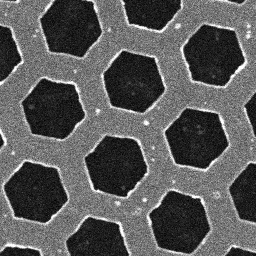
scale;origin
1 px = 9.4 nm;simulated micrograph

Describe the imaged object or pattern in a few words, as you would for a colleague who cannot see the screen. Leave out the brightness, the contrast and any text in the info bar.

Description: holes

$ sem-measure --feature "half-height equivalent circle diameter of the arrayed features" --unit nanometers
558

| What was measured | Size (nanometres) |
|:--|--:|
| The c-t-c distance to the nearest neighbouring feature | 796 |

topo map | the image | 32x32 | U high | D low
UUUUUUDDDDDDUUUDDDDDDDDUUUUUUUUU
UUUUUUDDDDDDUUUUDDDDDDUUUUUUUUUU
UUUUUDDDDDDDUUUUDDDDDUUUUUUUUUUU
DUUUUDDDDDDDDUUUUUDDUUUUUDDDUUUU
DDUUUUDDDDDDUUUUUUUUUUUUDDDDDDUU
DDUUUUDDDDDDUUUUUUUUUUUDDDDDDDUU
DDUUUUUDDDDUUUUDUUUUUUUDDDDDDDUU
DDDUUUUUUUUUUUDDDDDUUUUDDDDDDDDU
DDUUUUUUUUUUUUDDDDDDUUUUDDDDDDUU
DUUUUUUUUUUUUDDDDDDDUUUUDDDDDUUU
UUUUUDDDDUUUUDDDDDDDUUUUUUDDUUUU
UUUUDDDDDDUUUDDDDDDDUUUUUUUUUUUU
UUUDDDDDDDUUUUDDDDDDUUUUUUUUUUUD
UUUDDDDDDDUUUUUDDDDUUUUUUUUUUUUD
UUUDDDDDDDDUUUUUUUUUUUDDDDDUUUUD
UUUUDDDDDDUUUUUUUUUUUDDDDDDDUUUD
UUUUDDDDDUUUUUUUUUUUUDDDDDDDUUUU
UUUUUUUUUUUUUDDDDUUUUDDDDDDDUUUU
UUUUUUUUUUUUDDDDDDUUUDDDDDDDUUUU
UUUUUUUUUUUDDDDDDDUUUUDDDDDUUUUU
UUUDDUUUUUUDDDDDDDUUUUDDDDUUUUUD
UUDDDDDUUUUDDDDDDDUUUUUUUUUUUUDD
UDDDDDDDUUUDDDDDDDUUUUUUUUUUUDDD
DDDDDDDDUUUUDDDDDUUUUUUUUUUUUDDD
UDDDDDDDUUUUUUUDUUUUUDDDUUUUUDDD
UDDDDDDDUUUUUUUUUUUUDDDDDUUUUDDD
UUDDDDDUUUUUUUUUUUUDDDDDDDUUUUDD
UUUUDDUUUUUDDUUUUUUDDDDDDDUUUUUD
UUUUUUUUUUDDDDDUUUUDDDDDDDUUUUUU
UUUUUUUUUDDDDDDUUUUDDDDDDDUUUUUU
UUUUUUUUDDDDDDDDUUUUDDDDDUUUUUUU
DDDDDUUUUDDDDDDDUUUUUUDDUUUUUDDD